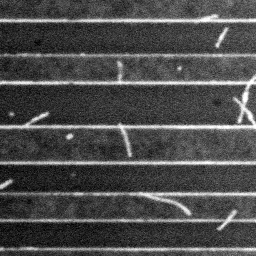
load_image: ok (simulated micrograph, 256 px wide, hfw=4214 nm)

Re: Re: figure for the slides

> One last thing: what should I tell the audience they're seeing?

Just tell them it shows lines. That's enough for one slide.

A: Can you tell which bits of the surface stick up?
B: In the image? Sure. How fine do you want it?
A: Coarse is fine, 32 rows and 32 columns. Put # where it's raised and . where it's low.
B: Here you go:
################################
################################
################################
................................
................................
................................
................................
################################
################################
################################
..............................##
................................
................................
................................
................................
................................
################################
################################
################################
################################
................................
................................
................................
................................
################################
################################
################################
################################
................................
................................
................................
################################